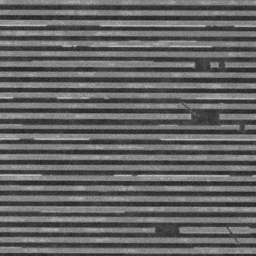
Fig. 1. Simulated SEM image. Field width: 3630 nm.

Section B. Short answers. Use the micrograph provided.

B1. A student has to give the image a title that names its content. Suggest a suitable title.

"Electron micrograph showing parallel lines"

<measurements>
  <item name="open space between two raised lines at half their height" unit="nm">76.2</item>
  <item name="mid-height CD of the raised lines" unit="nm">76.2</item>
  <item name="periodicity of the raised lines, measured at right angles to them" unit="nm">147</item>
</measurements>